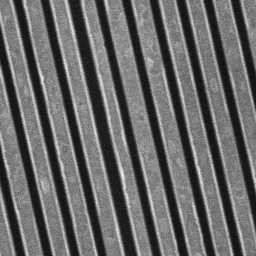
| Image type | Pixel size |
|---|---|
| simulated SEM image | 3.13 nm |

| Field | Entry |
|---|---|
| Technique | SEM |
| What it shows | parallel lines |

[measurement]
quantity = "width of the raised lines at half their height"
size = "55.3 nm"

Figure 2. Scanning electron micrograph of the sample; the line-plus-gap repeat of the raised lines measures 83 nm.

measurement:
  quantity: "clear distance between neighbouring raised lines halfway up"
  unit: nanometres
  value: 29.4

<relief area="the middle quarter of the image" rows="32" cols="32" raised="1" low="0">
11111000111000111100111110011111
11111000111000111100011110001111
01111000111100111100011110001111
01111000011100111110011111001111
01111000011100011110011111001111
01111100011100011110001111001111
01111100011110011110001111000111
00111100001110011111001111000111
00111100001110001111001111100111
00111110001110001111001111100111
00111110001110001111000111100011
00011110001111001111000111100011
00011110000111001111100111110011
10011110000111000111100111110011
10011111000111000111100011110001
10011111000111100111100011110001
10001111000111100111110011110001
10001111000011100011110011111001
11001111000011100011110011111001
11001111100011110011110001111000
11000111100011110011110001111000
11000111100001110011111001111100
11100111100001110001111001111100
11100111110001110001111000111100
11100111110001111001111100111100
11100011110000111001111100111110
11100011110000111000111100111110
11110011111000111000111100011110
11110011111000111100111100011110
11110001111000011100111100011110
11110001111000011100111110011111
11111001111100011100011110011111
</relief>